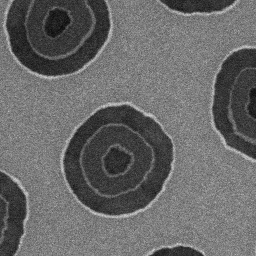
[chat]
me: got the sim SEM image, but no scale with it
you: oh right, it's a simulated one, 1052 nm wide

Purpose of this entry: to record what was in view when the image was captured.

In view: ring-shaped grooves with a dot in the middle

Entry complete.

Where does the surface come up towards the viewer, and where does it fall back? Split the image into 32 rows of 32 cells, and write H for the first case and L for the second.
HLLLHHHHHHHLLHHHHHHHLLLLLLLLLHHH
HLLLHHLLHHHLLLHHHHHHHHLLLLLLHHHH
HLLHHHLLLHHHLLHHHHHHHHHHHHHHHHHH
HLLHHHLLHHHHLLHHHHHHHHHHHHHHHHHH
HLLHHHLHHHHLLLHHHHHHHHHHHHHHHHHH
HLLLHHHHHHLLLHHHHHHHHHHHHHHHHHHH
HHLLLHHHHLLLHHHHHHHHHHHHHHHHHLLL
HHLLLLLLLLLLHHHHHHHHHHHHHHHHLLLL
HHHLLLLLLLHHHHHHHHHHHHHHHHHHLLLL
HHHHHLLLHHHHHHHHHHHHHHHHHHHLLLHH
HHHHHHHHHHHHHHHHHHHHHHHHHHHLLHHH
HHHHHHHHHHHHHHHHHHHHHHHHHHHLLHHL
HHHHHHHHHHHHHHHHHHHHHHHHHHHLLHHL
HHHHHHHHHHHHHLLLLHHHHHHHHHLLLHHL
HHHHHHHHHHHLLLLLLLLHHHHHHHHLLHHL
HHHHHHHHHHLLLLLLLLLLHHHHHHHLLHHH
HHHHHHHHHLLLHHHHHLLLLHHHHHHLLLHH
HHHHHHHHHLLHHHHHHHLLLHHHHHHHLLLH
HHHHHHHHLLHHHHLHHHHLLLHHHHHHHLLL
HHHHHHHHLLHHHLLLHHHLLLHHHHHHHHHL
HHHHHHHHLLHHHLLLHHHLLLHHHHHHHHHH
HHHHHHHHLLHHHLLLHHHLLHHHHHHHHHHH
LLHHHHHHLLLHHHHHHHLLLHHHHHHHHHHH
LLLHHHHHHLLHHHHHHLLLHHHHHHHHHHHH
LLLHHHHHHLLLLHLLLLLLHHHHHHHHHHHH
HLLHHHHHHHLLLLLLLLLHHHHHHHHHHHHH
HLLHHHHHHHHHLLLLLHHHHHHHHHHHHHHH
HLLHHHHHHHHHHHHHHHHHHHHHHHHHHHHH
HLLHHHHHHHHHHHHHHHHHHHHHHHHHHHHH
LLLHHHHHHHHHHHHHHHHHHHHHHHHHHHHH
LLHHHHHHHHHHHHHHHHHHHHHHHHHHHHHH
LLHHHHHHHHHHHHHHHHHLLLLLLHHHHHHH